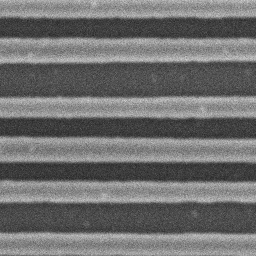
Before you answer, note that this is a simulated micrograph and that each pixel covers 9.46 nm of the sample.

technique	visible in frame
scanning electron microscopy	lines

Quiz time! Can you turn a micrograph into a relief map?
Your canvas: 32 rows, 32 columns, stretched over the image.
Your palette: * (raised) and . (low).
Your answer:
********************************
********************************
................................
................................
................................
********************************
********************************
********************************
................................
................................
................................
................................
********************************
********************************
********************************
................................
................................
********************************
********************************
********************************
................................
................................
................................
********************************
********************************
................................
................................
................................
................................
********************************
********************************
********************************